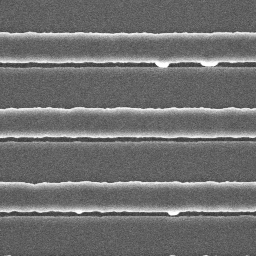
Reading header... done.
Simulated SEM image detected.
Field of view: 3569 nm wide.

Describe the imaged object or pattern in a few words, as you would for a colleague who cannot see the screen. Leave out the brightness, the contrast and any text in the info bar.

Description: lines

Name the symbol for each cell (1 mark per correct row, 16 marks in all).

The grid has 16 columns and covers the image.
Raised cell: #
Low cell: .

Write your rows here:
................
................
################
################
................
................
................
################
################
................
................
################
################
................
................
................